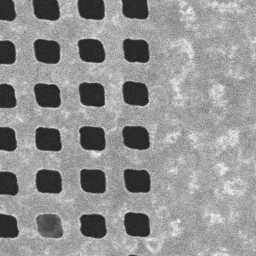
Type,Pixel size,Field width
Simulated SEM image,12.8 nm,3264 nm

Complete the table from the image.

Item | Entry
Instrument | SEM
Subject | a regular array of holes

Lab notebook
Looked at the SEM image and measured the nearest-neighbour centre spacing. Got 552 nanometres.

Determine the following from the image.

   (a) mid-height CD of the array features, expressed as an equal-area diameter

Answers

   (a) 343 nanometres